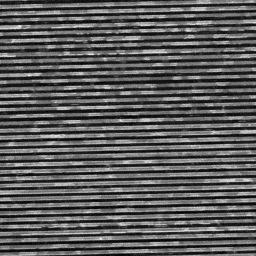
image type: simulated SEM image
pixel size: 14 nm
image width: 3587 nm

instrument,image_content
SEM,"parallel lines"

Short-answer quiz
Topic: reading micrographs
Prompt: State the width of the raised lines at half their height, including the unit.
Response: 3.13 px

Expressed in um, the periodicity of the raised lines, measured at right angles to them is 0.0963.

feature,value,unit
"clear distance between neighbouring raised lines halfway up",52.5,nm